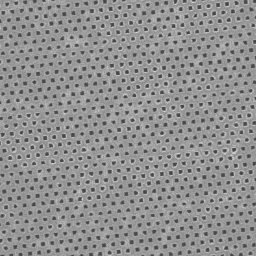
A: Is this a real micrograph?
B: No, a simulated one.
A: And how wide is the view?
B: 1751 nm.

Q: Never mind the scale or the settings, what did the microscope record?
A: a regular array of holes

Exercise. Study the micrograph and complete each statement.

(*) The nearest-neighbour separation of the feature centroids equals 60.8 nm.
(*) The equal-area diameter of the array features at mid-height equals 4.23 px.